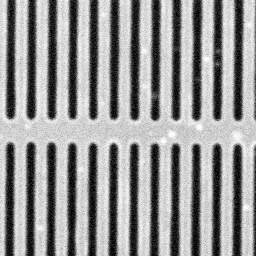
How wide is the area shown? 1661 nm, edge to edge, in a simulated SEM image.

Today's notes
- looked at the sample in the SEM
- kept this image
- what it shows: groups of lines, slits or small figures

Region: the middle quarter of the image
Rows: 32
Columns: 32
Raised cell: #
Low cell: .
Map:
#...##...##...##...##...###..###
#...##...##...##...##...###..###
#...##...##...##...##...###..###
#...##...##...##...##...###..###
#...##...##...##...##...###..###
#...##...##...##...##...###..###
#...##...##...##...##...###..###
#...##...##...##...##...###..###
#...##...##...##...##...###..###
#...##...##...##...##...###..###
#...##...##...##...##...###..###
#...##...##...##...##...###..###
#..###...##...##...##...###..###
#..###..###...##...###..###..###
#################.##############
################################
################################
################################
################################
############.####.##############
#..###..###...##...###..###..###
#..###...##...##...##...###..###
#..###...##...##...##...###..###
#..###...##...##...##...###..###
#..###...##...##...##...###..###
#..###...##...##...##...###..###
#..###...##...##...##...###..###
#..###...##...##...##...###..###
#..###...##...##...##...###..###
#..###...##...##...##...###..###
#..###...##...##...##...###..###
#..###...##...##...##...###..###